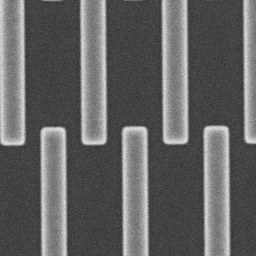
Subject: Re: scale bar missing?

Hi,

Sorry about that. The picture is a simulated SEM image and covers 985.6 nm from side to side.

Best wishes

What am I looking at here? groups of lines, slits or small figures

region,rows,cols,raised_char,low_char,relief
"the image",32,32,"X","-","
XXX-------XXX-------XXX--------X
XXX-------XXX-------XXX--------X
XXX-------XXX-------XXX--------X
XXX-------XXX-------XXX--------X
XXX-------XXX-------XXX--------X
XXX-------XXX-------XXX--------X
XXX-------XXX-------XXX--------X
XXX-------XXX-------XXX--------X
XXX-------XXX-------XXX--------X
XXX-------XXX-------XXX--------X
XXX-------XXX-------XXX--------X
XXX-------XXX-------XXX--------X
XXX-------XXX-------XXX--------X
XXX-------XXX-------XXX--------X
XXX-------XXX-------XXX--------X
XXX-------XXX-------XXX--------X
XXX--XXX--XXX--XXX--XXX---XXX--X
XXX--XXX--XXX--XXX---XX---XXX--X
-----XXX-------XXX--------XXX---
-----XXX-------XXX--------XXX---
-----XXX-------XXX--------XXX---
-----XXX-------XXX--------XXX---
-----XXX-------XXX--------XXX---
-----XXX--------XX--------XXX---
-----XXX--------XX--------XXX---
-----XXX--------XX--------XXX---
-----XXX--------XX--------XXX---
-----XXX--------XX--------XXX---
-----XXX--------XX--------XXX---
-----XXX--------XX--------XXX---
-----XXX--------XX--------XXX---
-----XXX--------XX--------XXX---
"